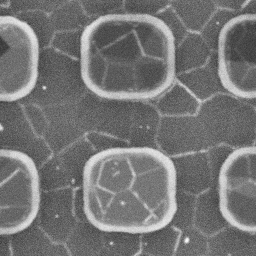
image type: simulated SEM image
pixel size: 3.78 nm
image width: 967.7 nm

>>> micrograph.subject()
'raised bodies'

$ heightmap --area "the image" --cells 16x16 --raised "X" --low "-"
----------------
X-----XXXX----XX
XX---XXXXXX---XX
XX---XXXXXX---XX
XX---XXXXXX---XX
XX----XXXX-----X
----------------
----------------
----------------
-------XX------X
XX----XXXXX---XX
XX---XXXXXX---XX
XX---XXXXXX---XX
XX----XXXXX---XX
----------------
----------------